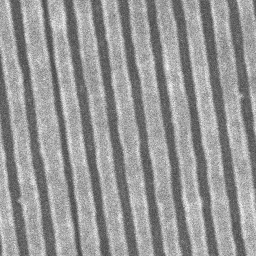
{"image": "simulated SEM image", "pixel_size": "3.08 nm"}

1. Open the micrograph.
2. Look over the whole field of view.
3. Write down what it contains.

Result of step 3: parallel lines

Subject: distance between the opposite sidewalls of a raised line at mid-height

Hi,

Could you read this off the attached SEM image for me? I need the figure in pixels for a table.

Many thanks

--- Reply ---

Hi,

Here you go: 15.7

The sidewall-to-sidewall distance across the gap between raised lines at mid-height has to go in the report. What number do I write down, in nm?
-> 36.1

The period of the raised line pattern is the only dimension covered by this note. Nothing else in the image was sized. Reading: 0.0822 micrometres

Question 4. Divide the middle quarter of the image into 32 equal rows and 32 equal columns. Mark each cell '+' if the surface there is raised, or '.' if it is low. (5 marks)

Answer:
++...++++...+++...++++...++++...
++...++++...+++....++++..++++...
++...++++...++++...++++...+++...
++...++++...++++...++++...+++...
++....+++...++++...++++...++++..
+++...++++..++++....+++...++++..
+++...++++...++++...+++...++++..
+++...++++...++++...+++....+++..
+++....+++...++++...++++...+++..
+++....+++...++++...++++...+++..
++++...+++...++++...++++...++++.
++++...+++...++++...++++...++++.
++++...+++....+++....+++...++++.
++++...+++....+++....+++...++++.
.+++...++++...++++...+++...++++.
.+++...++++...++++...++++...+++.
.+++....+++...++++...++++...++++
.+++....+++...++++...++++...++++
.+++....+++...++++...++++...++++
.++++...+++...+++++..++++...++++
.++++...+++....++++...++++..++++
.++++...++++...++++...++++..++++
.++++...++++...++++...++++...+++
..+++...++++...++++...++++...+++
..++++..++++...++++...++++...+++
..++++..++++....+++...++++...+++
..++++...+++....+++....+++...+++
..++++...+++....++++...+++....++
...+++...++++...++++...+++...+++
...+++...++++...++++...+++....++
...+++....+++...++++...++++...++
+..++++...+++...++++...++++...++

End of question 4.